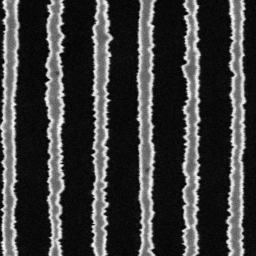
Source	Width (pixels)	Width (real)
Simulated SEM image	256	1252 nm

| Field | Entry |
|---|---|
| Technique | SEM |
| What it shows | parallel lines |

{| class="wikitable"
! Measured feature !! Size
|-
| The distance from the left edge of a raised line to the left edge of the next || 222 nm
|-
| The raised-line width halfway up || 53.2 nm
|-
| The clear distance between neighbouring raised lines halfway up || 167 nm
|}